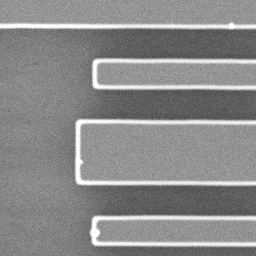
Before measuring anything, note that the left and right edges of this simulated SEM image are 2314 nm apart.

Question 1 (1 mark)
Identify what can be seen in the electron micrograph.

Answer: groups of lines, slits or small figures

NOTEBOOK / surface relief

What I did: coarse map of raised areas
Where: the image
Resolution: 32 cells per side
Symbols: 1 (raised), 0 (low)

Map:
11111111111111111111111111111111
11111111111111111111111111111111
11111111111111111111111111111111
00000000000000000000000000001100
00000000000000000000000000000000
00000000000000000000000000000000
00000000000000000000000000000000
00000000000000000000000000000000
00000000000011111111111111111111
00000000000011111111111111111111
00000000000011111111111111111111
00000000000000000000000000000000
00000000000000000000000000000000
00000000000000000000000000000000
00000000000000000000000000000000
00000000001111111111111111111111
00000000001111111111111111111111
00000000001111111111111111111111
00000000001111111111111111111111
00000000001111111111111111111111
00000000001111111111111111111111
00000000001111111111111111111111
00000000001111111111111111111111
00000000000000000000000000000000
00000000000000000000000000000000
00000000000000000000000000000000
00000000000000000000000000000000
00000000000011111111111111111111
00000000000011111111111111111111
00000000000011111111111111111111
00000000000011111111111111111111
00000000000000000000000000000000